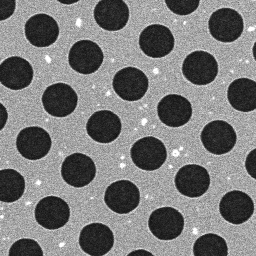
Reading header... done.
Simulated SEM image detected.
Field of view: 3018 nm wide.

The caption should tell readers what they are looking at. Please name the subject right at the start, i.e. a regular array of holes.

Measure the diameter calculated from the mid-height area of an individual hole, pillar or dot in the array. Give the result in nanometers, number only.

412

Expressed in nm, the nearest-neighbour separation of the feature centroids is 591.